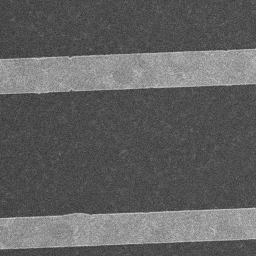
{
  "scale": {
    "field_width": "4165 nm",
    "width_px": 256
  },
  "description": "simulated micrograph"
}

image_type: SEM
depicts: one or a few lines or trenches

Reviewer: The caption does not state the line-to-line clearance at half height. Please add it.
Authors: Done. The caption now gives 2.02 um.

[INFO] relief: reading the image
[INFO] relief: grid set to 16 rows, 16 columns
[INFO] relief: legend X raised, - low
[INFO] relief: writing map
----------------
----------------
----------------
------XXXXXXXXXX
XXXXXXXXXXXXXXXX
XXXXXXXXX-------
----------------
----------------
----------------
----------------
----------------
----------------
----------------
----XXXXXXXXXXXX
XXXXXXXXXXXXXXXX
XX--------------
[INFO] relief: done